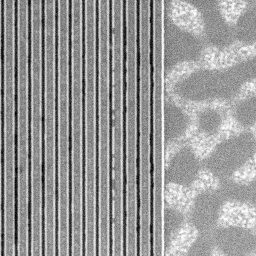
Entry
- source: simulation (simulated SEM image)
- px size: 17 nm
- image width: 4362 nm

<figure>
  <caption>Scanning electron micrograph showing parallel lines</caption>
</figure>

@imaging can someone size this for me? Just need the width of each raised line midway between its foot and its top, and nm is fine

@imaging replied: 149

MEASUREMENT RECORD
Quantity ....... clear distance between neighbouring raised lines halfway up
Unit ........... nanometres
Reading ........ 83.1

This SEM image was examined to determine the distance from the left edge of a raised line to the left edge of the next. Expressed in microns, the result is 0.231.